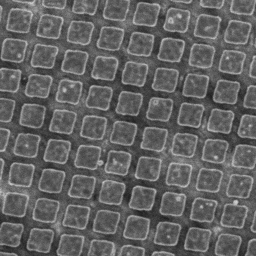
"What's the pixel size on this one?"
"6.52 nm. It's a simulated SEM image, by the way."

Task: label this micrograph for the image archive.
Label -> a regular array of raised bodies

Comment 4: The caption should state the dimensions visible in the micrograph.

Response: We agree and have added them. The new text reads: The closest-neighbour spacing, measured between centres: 0.196 microns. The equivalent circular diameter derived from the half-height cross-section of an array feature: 165 nm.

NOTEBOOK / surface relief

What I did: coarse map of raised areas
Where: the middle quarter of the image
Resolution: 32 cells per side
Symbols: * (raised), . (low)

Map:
*****...*****..******...........
*****..******..******..*****....
...**..******..******..******..*
........****...*****...*****...*
***............*****..******..**
****...*..............******..**
****..******............****..**
****..******..*****...........**
****..******..******..**........
***...*****...*****...*****.....
......*****..******..******..***
.............******..******..***
***............***...******..***
***..*****...........*****...***
***..******..**..............***
**...*****...*****.............*
**..******..******..*****.......
....******..******..******..**..
......****..*****...*****...****
*...........*****..******..*****
**..**.............******..*****
*...*****.............***..*****
*..******..*****...........*****
*..******..******..***..........
...******..*****...*****........
...*****..******..******..******
..........******..******..******
.............***..******..******
..*****............****...*****.
..******..***.............*****.
..*****...*****..............*..
.******..******..******.........